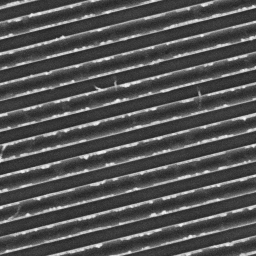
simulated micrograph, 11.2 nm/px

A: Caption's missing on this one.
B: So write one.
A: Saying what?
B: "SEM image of parallel lines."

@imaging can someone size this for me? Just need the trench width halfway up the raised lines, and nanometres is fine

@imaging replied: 146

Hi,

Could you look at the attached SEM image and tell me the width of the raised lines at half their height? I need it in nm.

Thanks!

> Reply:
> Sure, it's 188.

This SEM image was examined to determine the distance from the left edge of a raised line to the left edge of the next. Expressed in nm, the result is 333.